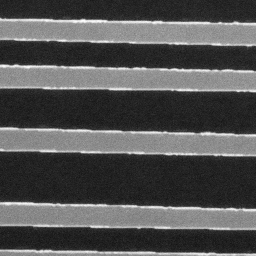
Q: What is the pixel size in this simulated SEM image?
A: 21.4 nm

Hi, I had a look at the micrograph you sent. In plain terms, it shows lines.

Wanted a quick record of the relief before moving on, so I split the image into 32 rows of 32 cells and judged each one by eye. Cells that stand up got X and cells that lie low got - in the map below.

--------------------------------
--------------------------------
XXXXX---------------------------
XXXXXXXXXXXXXXXXXXXXXXXXXXXXXXXX
XXXXXXXXXXXXXXXXXXXXXXXXXXXXXXXX
--------------------------XXXXXX
--------------------------------
--------------------------------
XXXXXXXXXXXX--------------------
XXXXXXXXXXXXXXXXXXXXXXXXXXXXXXXX
XXXXXXXXXXXXXXXXXXXXXXXXXXXXXXXX
--------------------------------
--------------------------------
--------------------------------
--------------------------------
--------------------------------
XXXXXXXXXXXXXXX-----------------
XXXXXXXXXXXXXXXXXXXXXXXXXXXXXXXX
XXXXXXXXXXXXXXXXXXXXXXXXXXXXXXXX
--------------------------------
--------------------------------
--------------------------------
--------------------------------
--------------------------------
--------------------------------
XXXXXXX-------------------------
XXXXXXXXXXXXXXXXXXXXXXXXXXXXXXXX
XXXXXXXXXXXXXXXXXXXXXXXXXXXXXXXX
-------------------XXXXXXXXXXXXX
--------------------------------
--------------------------------
XXXXXXXXXXXX--------------------